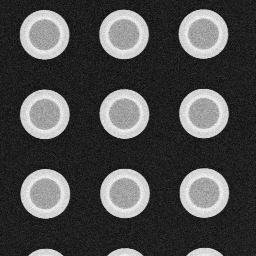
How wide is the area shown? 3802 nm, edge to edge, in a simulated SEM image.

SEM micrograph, an array of small figures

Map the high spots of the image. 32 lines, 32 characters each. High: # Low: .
................................
....###.......###.......###.....
...#####.....#####.....#####....
...######....#####....######....
...######...#######...######....
...#####.....#####.....#####....
...#####.....#####.....#####....
................................
................................
................................
................................
....###.......###.......###.....
...#####.....#####.....#####....
...######....######...######....
...######...#######...#######...
...#####.....#####.....#####....
...#####.....#####.....#####....
................................
................................
................................
................................
....###.......###.......###.....
...#####.....#####.....#####....
...######....######....######...
...######....######....######...
...#####.....#####.....#####....
....####......####......####....
................................
................................
................................
................................
....###.......###.......###.....